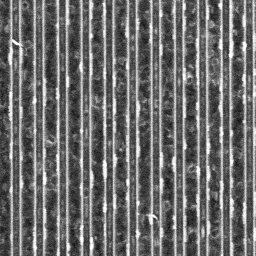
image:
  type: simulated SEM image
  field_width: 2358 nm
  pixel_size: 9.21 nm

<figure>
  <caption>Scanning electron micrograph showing parallel lines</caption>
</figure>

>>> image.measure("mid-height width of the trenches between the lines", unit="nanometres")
69.1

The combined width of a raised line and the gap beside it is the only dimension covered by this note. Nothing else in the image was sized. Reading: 215 nm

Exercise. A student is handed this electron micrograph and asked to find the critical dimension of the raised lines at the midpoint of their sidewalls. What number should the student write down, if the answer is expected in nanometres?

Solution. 146